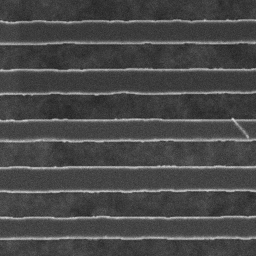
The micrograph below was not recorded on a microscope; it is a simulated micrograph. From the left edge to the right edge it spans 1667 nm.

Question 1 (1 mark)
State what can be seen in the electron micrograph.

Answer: lines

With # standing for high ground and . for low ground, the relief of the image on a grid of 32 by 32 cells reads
................................
................................
................................
################################
################################
#####...........................
................................
................................
................................
################################
################################
################################
................................
................................
................................
################################
################################
#####.##############..#####...##
................................
................................
................................
################################
################################
################################
................................
................................
................................
################################
################################
################################
................................
................................